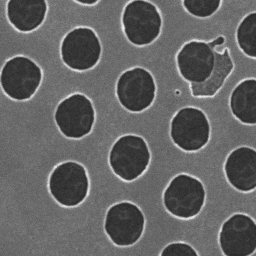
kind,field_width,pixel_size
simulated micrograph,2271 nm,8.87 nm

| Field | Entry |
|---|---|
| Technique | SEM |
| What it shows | a regular array of holes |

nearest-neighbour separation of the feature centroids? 0.588 µm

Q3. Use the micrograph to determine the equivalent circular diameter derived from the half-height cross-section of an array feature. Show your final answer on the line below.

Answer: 365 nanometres